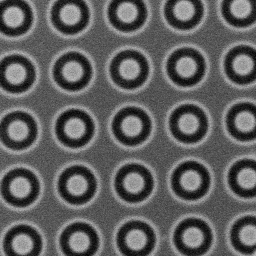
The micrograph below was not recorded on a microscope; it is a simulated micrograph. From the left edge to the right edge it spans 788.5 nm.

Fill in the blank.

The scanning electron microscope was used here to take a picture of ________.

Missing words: an array of small figures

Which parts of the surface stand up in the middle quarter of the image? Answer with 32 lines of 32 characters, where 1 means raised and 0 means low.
11110001111000111110001110001111
11110001111000111110001110001111
11110001111000111110011111000111
11110001111100011100011111000000
00000001111100000000111111100000
00000011111110000001111111110000
00000111111111100011111111111111
11111111111111111111111111111111
11111111111111111111111111111111
11111111111111111111111111111111
11111111111111110011111111111000
00000111111111000000111111100000
00000011111110000000011111100000
00000001111100011100001111000111
01111001111100011110001111000111
11111000111100111110001111000111
11111000111100011110001111000111
01111001111100011110001111100000
00000001111110000000011111100000
00000011111111000000111111111000
00000011111111100011111111111111
11111111111111111111111111111111
11111111111111111111111111111111
11111111111111111111111111111111
11111111111111111011111111111000
10000111111111000000111111110000
00000001111110000000011111100000
00000001111110001100001111100011
00111000111110011110001111100111
01111000111100011111000111000111
01111100111100011111001111100011
01111100111110001110001111100001